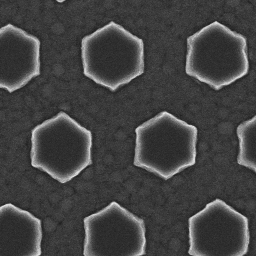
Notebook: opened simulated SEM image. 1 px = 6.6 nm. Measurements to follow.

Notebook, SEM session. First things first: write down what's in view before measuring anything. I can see raised bodies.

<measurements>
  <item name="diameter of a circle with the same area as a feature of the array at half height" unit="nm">398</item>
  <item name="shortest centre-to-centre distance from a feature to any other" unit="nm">681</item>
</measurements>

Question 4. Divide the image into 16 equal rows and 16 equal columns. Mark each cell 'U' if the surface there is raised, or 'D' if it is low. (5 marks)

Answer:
DDDDDDDDDDDDDDDD
DDDDDDDDDDDDDDDD
UUDDDUUUUDDDUUUD
UUDDDUUUUDDDUUUD
UUDDDUUUUDDDUUUD
UDDDDDDDDDDDDDDD
DDDDDDDDDDDDDDDD
DDDUDDDDDDUDDDDD
DDUUUUDDDUUUDDDU
DDUUUUDDDUUUDDDU
DDDUUDDDDUUDDDDD
DDDDDDDDDDDDDDDD
DDDDDDDDDDDDDDDD
UUDDDDUUDDDDUUUD
UUDDDUUUUDDDUUUD
UUDDDUUUUDDDUUUD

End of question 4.